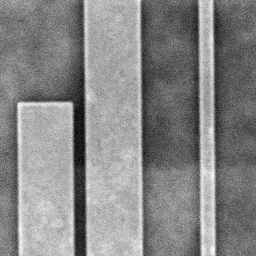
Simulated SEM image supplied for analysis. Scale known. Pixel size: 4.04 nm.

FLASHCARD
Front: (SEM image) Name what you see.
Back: groups of lines, slits or small figures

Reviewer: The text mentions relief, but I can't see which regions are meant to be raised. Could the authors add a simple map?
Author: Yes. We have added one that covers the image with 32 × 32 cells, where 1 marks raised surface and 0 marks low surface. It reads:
00000000000111111000000001000000
00000000000111111000000001000000
00000000000111111000000001000000
00000000000111111000000001100000
00000000000111111000000001100000
00000000000111111000000001100000
00000000000111111000000001100000
00000000000111111000000001100000
00000000000111111000000001100000
00000000000111111000000001100000
00000000000111111100000001100000
00000000000111111100000001100000
00000000000111111100000001100000
00111111100111111100000001100000
00111111100111111100000001100000
00111111100111111100000001100000
00111111100111111100000001100000
00111111100111111100000001100000
00111111100111111100000001100000
00111111100111111100000001100000
00111111100111111100000001100000
00111111100111111100000001100000
00111111100111111100000001100000
00111111100111111100000001100000
00111111100111111100000001100000
00111111100111111100000001100000
00111111100111111100000001100000
00111111100111111100000001100000
00111111100111111100000001100000
00111111100111111100000001100000
00111111100111111100000001100000
00111111100111111100000001100000